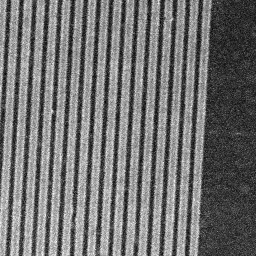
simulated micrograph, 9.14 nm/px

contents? parallel lines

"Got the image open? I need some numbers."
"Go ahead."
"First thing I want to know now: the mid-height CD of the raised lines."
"60.5 nanometres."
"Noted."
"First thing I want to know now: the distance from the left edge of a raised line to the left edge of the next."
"0.117 micrometres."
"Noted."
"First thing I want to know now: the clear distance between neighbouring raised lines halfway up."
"54.8 nanometers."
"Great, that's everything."